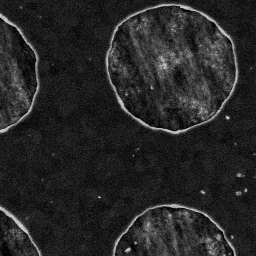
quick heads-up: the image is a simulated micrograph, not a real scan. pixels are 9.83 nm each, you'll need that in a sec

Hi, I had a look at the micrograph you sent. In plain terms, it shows holes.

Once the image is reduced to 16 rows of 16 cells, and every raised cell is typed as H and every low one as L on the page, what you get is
HHHHHHHHHHLLHHHH
LHHHHHHHLLLLLHHH
LLHHHHHLLLLLLLHH
LLHHHHHLLLLLLLLH
LLHHHHHLLLLLLLLH
LLHHHHHLLLLLLLLH
LLHHHHHHLLLLLLHH
LHHHHHHHHLLLLHHH
HHHHHHHHHHHHHHHH
HHHHHHHHHHHHHHHH
HHHHHHHHHHHHHHHH
HHHHHHHHHHHHHHHH
HHHHHHHHHHHHHHHH
LHHHHHHHHLLLLHHH
LLHHHHHHLLLLLLHH
LLHHHHHLLLLLLLHH